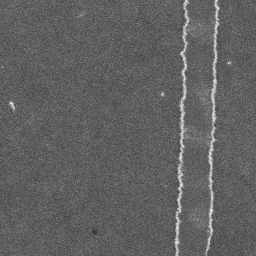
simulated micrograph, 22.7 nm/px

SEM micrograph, one or a few lines or trenches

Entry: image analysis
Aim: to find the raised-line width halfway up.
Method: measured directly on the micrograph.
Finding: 721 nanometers